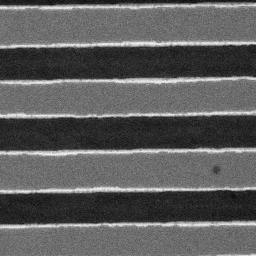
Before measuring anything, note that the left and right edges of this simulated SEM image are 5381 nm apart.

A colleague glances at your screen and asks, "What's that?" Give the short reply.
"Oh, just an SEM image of lines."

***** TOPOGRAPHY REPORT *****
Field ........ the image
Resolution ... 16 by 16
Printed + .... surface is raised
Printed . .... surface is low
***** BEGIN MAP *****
++++++++++++++++
++++++++++++++++
++++++++++++++++
................
................
++++++++++++++++
++++++++++++++++
................
................
....++++++++++++
++++++++++++++++
++++++++++++++++
................
................
++++++++++++++++
++++++++++++++++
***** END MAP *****